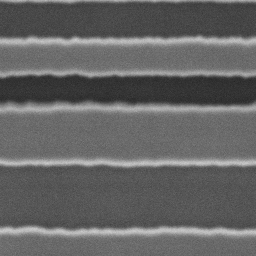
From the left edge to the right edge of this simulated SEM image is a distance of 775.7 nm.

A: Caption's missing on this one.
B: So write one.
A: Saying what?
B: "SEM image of lines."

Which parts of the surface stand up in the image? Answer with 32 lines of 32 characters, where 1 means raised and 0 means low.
00000000000000000000000000000000
00000000000000000000000000000000
00000000000000000000000000000000
00000000000000000000000000000000
00000000000000000000000000000000
11111111111111111111111111111111
11111111111111111111111111111111
11111111111111111111111111111111
11111111111111111111111111111111
10000000000100000000000000000000
00000000000000000000000000000000
00000000000000000000000000000000
00000000000000000000000000000000
11111111111111111111111111111111
11111111111111111111111111111111
11111111111111111111111111111111
11111111111111111111111111111111
11111111111111111111111111111111
11111111111111111111111111111111
11111111111111111111111111111111
11111111001101111111111111111111
00000000000000000000000000000000
00000000000000000000000000000000
00000000000000000000000000000000
00000000000000000000000000000000
00000000000000000000000000000000
00000000000000000000000000000000
00000000000000000000000000000000
00000000000000000000000000000000
11111111111111111111111111111111
11111111111111111111111111111111
11111111111111111111111111111111